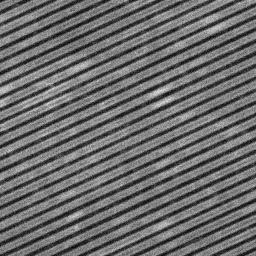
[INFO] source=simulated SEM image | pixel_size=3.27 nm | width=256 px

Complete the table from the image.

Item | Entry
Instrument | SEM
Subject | parallel lines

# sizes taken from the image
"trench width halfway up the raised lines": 14.1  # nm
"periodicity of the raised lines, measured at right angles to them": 36.3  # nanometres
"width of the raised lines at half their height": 0.0223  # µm